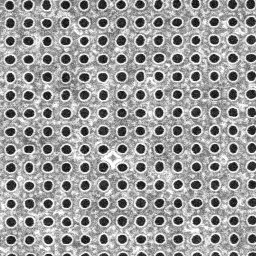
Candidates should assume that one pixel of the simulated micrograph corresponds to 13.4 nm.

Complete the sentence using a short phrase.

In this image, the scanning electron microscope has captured a regular array of holes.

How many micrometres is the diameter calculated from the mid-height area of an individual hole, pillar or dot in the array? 0.135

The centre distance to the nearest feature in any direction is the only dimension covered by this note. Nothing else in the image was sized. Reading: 239 nanometres